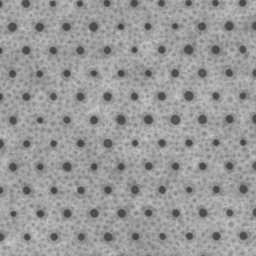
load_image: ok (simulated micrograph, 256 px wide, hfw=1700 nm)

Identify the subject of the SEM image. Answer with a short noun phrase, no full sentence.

a regular array of holes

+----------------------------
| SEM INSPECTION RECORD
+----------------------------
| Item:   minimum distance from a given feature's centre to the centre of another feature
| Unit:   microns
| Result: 0.177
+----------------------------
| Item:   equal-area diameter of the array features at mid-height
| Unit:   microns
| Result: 0.0593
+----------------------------